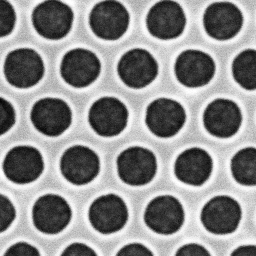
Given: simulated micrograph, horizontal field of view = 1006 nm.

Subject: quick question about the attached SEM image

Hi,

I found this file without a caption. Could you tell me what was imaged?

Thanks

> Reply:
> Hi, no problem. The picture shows a regular array of holes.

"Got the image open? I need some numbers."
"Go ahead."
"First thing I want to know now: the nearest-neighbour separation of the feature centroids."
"220 nanometres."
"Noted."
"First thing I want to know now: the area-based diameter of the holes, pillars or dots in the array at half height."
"163 nm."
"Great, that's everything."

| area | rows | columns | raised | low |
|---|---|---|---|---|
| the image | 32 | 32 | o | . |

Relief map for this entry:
.oooo...oooo...oooo...oooo...ooo
..oo.....oo.....oo.....oo.....oo
..oo.....oo.....oo.....oo......o
..oo.....oo.....oo.....oo.....oo
.oooo...oooo...oooo...oooo...ooo
oooooooooooooooooooooooooooooooo
o....ooo....oooo...oooo...oooo..
o....ooo....ooo.....oo.....oo...
......o......oo.....oo.....oo...
o....ooo....ooo.....oo.....oo...
o....ooo....oooo...oooo...oooo..
oooooooooooooooooooooooooooooooo
.oooo...oooo...oooo...ooooo..ooo
..oo.....oo.....oo.....ooo....oo
..oo.....oo.....oo.....oo.....oo
..oo.....oo.....oo.....oo.....oo
.oooo...oooo...oooo...oooo....oo
oooooooooooooooooooooooooooooooo
oo..oooo...ooooo..oooooo.ooooo..
o....ooo....ooo....ooo....ooo...
......o......o......oo.....oo...
.....ooo....ooo.....oo.....oo...
o....ooo....ooo....ooo....ooo...
oooooooooooooooooooooooooooooooo
.oooo...oooo...ooooo..ooooo..ooo
..oo.....oo.....oo.....ooo....oo
..oo.....oo.....oo.....oo.....oo
..oo.....oo.....oo.....oo.....oo
.ooo....oooo...oooo....ooo....oo
oooooooooooooooooooooooooooooooo
oo..ooooo..ooooo..ooooo..ooooooo
o....ooo....ooo....ooo....ooo...